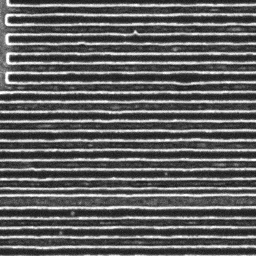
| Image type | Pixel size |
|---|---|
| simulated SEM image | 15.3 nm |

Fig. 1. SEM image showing parallel lines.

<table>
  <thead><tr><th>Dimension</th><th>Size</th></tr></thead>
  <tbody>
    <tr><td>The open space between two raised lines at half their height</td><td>0.124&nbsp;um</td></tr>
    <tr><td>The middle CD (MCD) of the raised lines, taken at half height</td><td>166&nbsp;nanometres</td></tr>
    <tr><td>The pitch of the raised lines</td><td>295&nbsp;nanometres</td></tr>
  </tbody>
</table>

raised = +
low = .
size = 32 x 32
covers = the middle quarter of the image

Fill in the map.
................................
................................
++++++++++++++++++++++++++++++++
++++++++++++++++++++++++++++++++
++++++++++++++++++++++++++++++++
................................
................................
++++++++++++++++++++++++++++++++
++++++++++++++++++++++++++++++++
+++++++++++++++++++..++++.......
................................
................................
++++++++++++++++++++++++++++++++
++++++++++++++++++++++++++++++++
................................
................................
................................
++++++++++++++++++++++++++++++++
++++++++++++++++++++++++++++++++
................................
................................
.......+++++++++++++++++++++++++
++++++++++++++++++++++++++++++++
++++++++++++++++++++++++++++++++
................................
................................
++++++++++++++++++++++++++++++++
++++++++++++++++++++++++++++++++
++++++++++++++++++++++++++++++++
................................
................................
++++++++++++++++++++++++++++++++